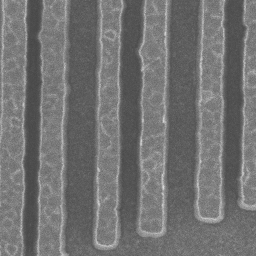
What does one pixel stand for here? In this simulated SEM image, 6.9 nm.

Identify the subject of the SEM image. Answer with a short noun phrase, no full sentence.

parallel lines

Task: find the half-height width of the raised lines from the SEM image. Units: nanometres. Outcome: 183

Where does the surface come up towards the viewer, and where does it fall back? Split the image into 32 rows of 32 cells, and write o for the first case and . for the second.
ooo..ooo....oooo..ooo....ooo..oo
ooo..ooo....ooo...ooo....ooo..oo
ooo..ooo....ooo...ooo....ooo..oo
oooo.ooo....ooo...ooo....ooo...o
oooo.ooo....ooo...ooo....ooo...o
oooo.ooo....ooo..oooo....ooo..oo
ooo..ooo....ooo..oooo....ooo..oo
ooo..ooo....ooo...ooo....ooo..oo
ooo..ooo....ooo...ooo....ooo..oo
ooo..ooo....ooo...ooo....ooo..oo
ooo..ooo....ooo...ooo....ooo..oo
ooo..ooo....ooo...ooo....ooo..oo
ooo..ooo....ooo..oooo....ooo..oo
ooo..ooo....ooo..oooo....ooo..oo
ooo..ooo....ooo...ooo....ooo..oo
ooo..ooo....ooo...ooo....ooo..oo
ooo..ooo....ooo...ooo....ooo..oo
ooo..ooo....ooo..oooo....ooo..oo
ooo..ooo....ooo..oooo....ooo..oo
ooo..ooo....ooo..oooo....ooo..oo
ooo..ooo....ooo..oooo....ooo..oo
ooo..ooo....ooo..oooo....ooo..oo
ooo..ooo....ooo..oooo...oooo..oo
ooo..ooo....ooo..oooo...oooo..oo
ooo..ooo....ooo..oooo....ooo..oo
ooo..ooo....ooo..oooo...oooo..oo
ooo..ooo....ooo..oooo....ooo....
ooo..ooo....ooo..oooo....oo.....
ooo..ooo....ooo..oooo...........
ooo..ooo....ooo.................
ooo.oooo....oo..................
ooo..ooo........................